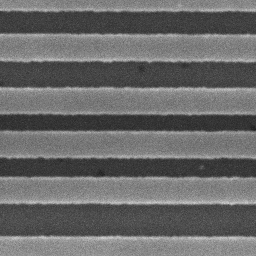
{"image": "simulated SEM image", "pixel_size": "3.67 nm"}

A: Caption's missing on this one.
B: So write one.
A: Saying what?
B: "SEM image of lines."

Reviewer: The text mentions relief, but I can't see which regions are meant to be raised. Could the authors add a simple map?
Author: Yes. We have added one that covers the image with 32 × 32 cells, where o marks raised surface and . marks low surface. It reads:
oooooooooooooooooooooooooooooooo
................................
................................
................................
oooooooooooooooooooooooooooooooo
oooooooooooooooooooooooooooooooo
oooooooooooooooooooooooooooooooo
oooooooooooooooooooooooooooooooo
................................
................................
................................
oooooooooooooooooooooooooooooooo
oooooooooooooooooooooooooooooooo
oooooooooooooooooooooooooooooooo
................................
................................
oooooooooooooooooooooooooo.ooooo
oooooooooooooooooooooooooooooooo
oooooooooooooooooooooooooooooooo
oooooooooooooooooooooooooooooooo
................................
................................
oooooooooooooooooooooooooooooooo
oooooooooooooooooooooooooooooooo
oooooooooooooooooooooooooooooooo
................................
................................
................................
................................
................................
oooooooooooooooooooooooooooooooo
oooooooooooooooooooooooooooooooo